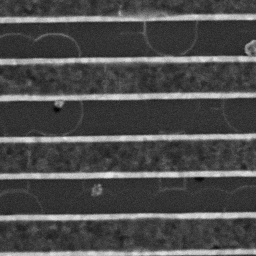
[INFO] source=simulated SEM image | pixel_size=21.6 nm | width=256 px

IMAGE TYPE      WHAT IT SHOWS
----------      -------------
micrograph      wiring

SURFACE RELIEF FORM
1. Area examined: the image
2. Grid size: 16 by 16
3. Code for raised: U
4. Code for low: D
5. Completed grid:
UUUUUUUUUUUUUUUU
DDDDDDDDDDDDDDDD
DDDDDDDDDDDDDDDD
DDDDDDDDDDDDDDDD
UUUUUUUUUUUUUUUU
UUUUUUUUUUUUUUUU
DDDDDDDDDDDDDDDD
DDDDDDDDDDDDDDDD
DDDDDDDDDDDDDDDD
UUUUUUUUUUUUUUUU
UUUUUUUUUUUUUUUU
DDDDDDDDDDDDDDDD
DDDDDDDDDDDDDDDD
DDDDDDDDDDDDUUUU
UUUUUUUUUUUUUUUU
UUUUUUUUUUUUUUUU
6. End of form